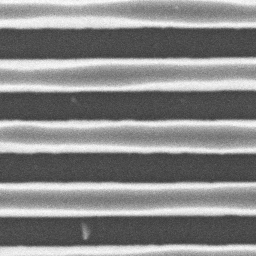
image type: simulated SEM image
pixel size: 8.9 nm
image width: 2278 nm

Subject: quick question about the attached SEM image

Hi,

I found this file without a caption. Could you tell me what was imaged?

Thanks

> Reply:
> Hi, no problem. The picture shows lines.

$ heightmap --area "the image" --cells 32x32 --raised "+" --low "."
++++++++++++++++++++++++++++++++
++++++++++++++++++++++++++++++++
++++++++++++++++++++++++++++++++
................................
................................
................................
................................
................................
++++++++++++++++++++++++++++++++
++++++++++++++++++++++++++++++++
++++++++++++++++++++++++++++++++
................................
................................
................................
................................
++++++++++++++++++++++++++++++++
++++++++++++++++++++++++++++++++
++++++++++++++++++++++++++++++++
++++++++++++++++++++++++++++++++
................................
................................
................................
................................
++++++++++++++++++++++++++++++++
++++++++++++++++++++++++++++++++
++++++++++++++++++++++++++++++++
++++++++++++++++++++++++++++++++
................................
................................
................................
................................
++++++++++++++++++++++++++++++++